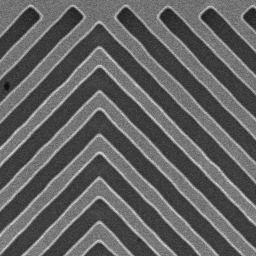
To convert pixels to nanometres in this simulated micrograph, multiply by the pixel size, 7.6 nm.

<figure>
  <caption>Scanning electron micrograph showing groups of lines, slits or small figures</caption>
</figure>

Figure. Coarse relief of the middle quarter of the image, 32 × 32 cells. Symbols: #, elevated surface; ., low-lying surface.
....##########......####......##
...#####..#####......####......#
..#####....#####......####......
.#####......#####......####.....
#####........#####.....#####....
####..........####......#####...
##.............#####.....#####..
##......##......#####.....#####.
.......####......#####.....#####
......######......#####.....####
.....########......####......###
....####.#####......#####.....##
...####...#####......####......#
..####.....#####......####......
.#####......####.......####.....
#####........#####......####....
####..........#####......####...
###............#####......####..
##......##......#####......####.
#......####......#####......####
......######......#####......###
.....########......####.......##
....####.#####......####.......#
...####...#####......####......#
..####.....#####......####......
.####.......#####......####.....
####.........#####......####....
###...........#####......#####..
##.............#####......####..
##.....###......#####......####.
#......####......#####......####
.....#######......#####......###